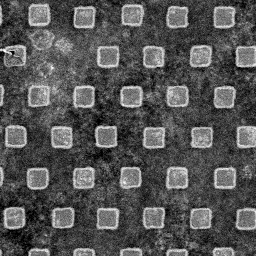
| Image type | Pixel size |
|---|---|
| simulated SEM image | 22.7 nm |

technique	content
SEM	a regular array of raised bodies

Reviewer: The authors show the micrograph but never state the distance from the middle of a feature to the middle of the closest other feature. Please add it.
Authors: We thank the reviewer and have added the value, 1.03 um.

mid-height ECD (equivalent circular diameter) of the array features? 500 nm